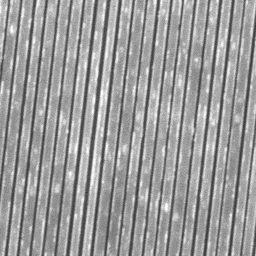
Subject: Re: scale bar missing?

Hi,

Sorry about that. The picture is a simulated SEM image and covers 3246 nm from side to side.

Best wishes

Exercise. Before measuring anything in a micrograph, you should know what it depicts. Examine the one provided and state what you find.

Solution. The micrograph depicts parallel lines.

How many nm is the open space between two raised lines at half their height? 44.1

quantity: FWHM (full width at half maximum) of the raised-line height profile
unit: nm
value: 112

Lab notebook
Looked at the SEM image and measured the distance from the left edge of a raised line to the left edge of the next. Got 0.156 microns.